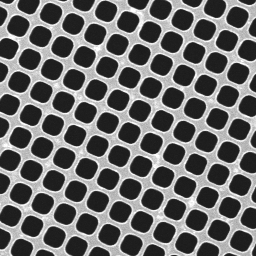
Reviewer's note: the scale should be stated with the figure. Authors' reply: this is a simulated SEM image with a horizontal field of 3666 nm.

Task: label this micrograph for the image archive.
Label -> a regular array of holes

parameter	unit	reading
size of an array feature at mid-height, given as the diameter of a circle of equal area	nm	307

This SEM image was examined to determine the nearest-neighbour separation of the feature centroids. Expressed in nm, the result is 347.